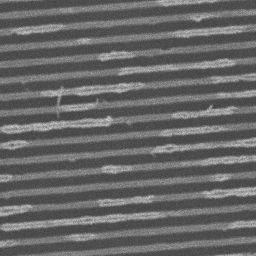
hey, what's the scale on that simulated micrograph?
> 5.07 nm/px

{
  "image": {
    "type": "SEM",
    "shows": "parallel lines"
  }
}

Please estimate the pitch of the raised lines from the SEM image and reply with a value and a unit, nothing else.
82.3 nm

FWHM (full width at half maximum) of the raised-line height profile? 31 nanometers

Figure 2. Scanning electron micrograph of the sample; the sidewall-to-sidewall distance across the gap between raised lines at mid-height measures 53.1 nanometres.